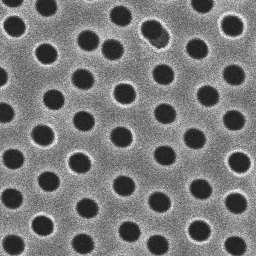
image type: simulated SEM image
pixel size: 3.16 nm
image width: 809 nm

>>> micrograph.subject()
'a regular array of holes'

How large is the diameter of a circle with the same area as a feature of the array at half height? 0.0637 microns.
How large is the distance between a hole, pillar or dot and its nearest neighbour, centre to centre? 0.115 micrometres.